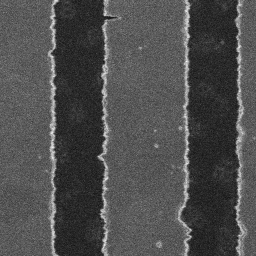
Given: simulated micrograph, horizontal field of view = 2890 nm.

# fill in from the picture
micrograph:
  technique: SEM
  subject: one or a few lines or trenches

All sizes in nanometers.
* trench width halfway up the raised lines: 579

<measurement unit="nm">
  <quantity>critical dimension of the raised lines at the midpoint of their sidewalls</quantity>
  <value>937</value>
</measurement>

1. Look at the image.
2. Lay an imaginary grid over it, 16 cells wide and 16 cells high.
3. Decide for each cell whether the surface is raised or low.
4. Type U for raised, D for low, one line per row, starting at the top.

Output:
UUUDDDDUUUUUDDDU
UUUDDDDUUUUUDDDU
UUUDDDDUUUUUDDDU
UUUDDDDUUUUUDDDU
UUUDDDDUUUUUDDDU
UUUDDDDUUUUUDDDU
UUUDDDUUUUUUDDDU
UUUDDDDUUUUUDDDU
UUUDDDDUUUUUDDDU
UUUDDDUUUUUUDDDU
UUUDDDDUUUUUDDDU
UUUDDDDUUUUUDDDU
UUUDDDUUUUUUDDDU
UUUDDDUUUUUDDDDU
UUUDDDDUUUUUDDDU
UUUDDDUUUUUUDDDU